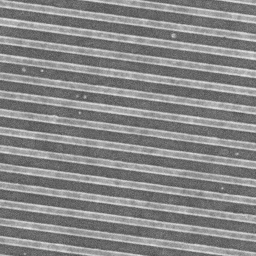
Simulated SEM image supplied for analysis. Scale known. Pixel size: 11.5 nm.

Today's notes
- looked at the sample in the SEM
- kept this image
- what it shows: parallel lines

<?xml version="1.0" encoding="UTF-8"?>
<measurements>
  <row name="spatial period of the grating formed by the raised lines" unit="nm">207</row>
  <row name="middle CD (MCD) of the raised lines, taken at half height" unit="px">6.45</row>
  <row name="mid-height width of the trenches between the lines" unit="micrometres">0.133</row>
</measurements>